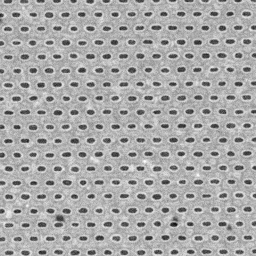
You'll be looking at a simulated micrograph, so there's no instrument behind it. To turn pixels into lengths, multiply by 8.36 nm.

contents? a regular array of holes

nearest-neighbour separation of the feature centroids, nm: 131